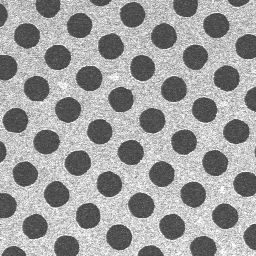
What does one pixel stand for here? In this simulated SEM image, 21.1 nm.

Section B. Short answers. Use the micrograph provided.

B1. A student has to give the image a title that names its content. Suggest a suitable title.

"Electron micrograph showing a regular array of holes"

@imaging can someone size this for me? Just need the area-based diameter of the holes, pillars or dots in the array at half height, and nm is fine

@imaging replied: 547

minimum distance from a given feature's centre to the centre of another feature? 796 nanometers